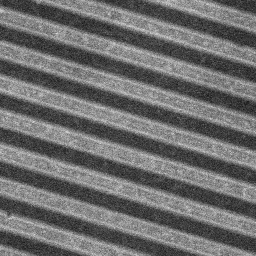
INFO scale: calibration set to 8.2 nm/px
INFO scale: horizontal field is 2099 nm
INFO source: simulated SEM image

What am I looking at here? parallel lines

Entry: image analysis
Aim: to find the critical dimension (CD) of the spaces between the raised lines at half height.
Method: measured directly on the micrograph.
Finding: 147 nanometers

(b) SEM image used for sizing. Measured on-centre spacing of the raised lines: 0.267 micrometres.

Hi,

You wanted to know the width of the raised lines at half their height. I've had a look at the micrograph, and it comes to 0.123 microns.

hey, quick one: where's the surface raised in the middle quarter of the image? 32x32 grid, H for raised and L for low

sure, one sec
HHHHLLLLLLLLLLLLLLLLHHHHHHHHHHHH
HHHHHHHHLLLLLLLLLLLLLLLHHHHHHHHH
HHHHHHHHHHHLLLLLLLLLLLLLLLLHHHHH
LHHHHHHHHHHHHHLLLLLLLLLLLLLLLLHH
LLLLLHHHHHHHHHHHHHLLLLLLLLLLLLLL
LLLLLLLLHHHHHHHHHHHHHLLLLLLLLLLL
LLLLLLLLLLLHHHHHHHHHHHHHLLLLLLLL
LLLLLLLLLLLLLLLHHHHHHHHHHHHLLLLL
HHLLLLLLLLLLLLLLLLHHHHHHHHHHHHHL
HHHHHHLLLLLLLLLLLLLLLHHHHHHHHHHH
HHHHHHHHHLLLLLLLLLLLLLLLLHHHHHHH
HHHHHHHHHHHHLLLLLLLLLLLLLLLLHHHH
LLLHHHHHHHHHHHHHLLLLLLLLLLLLLLLH
LLLLLLHHHHHHHHHHHHHLLLLLLLLLLLLL
LLLLLLLLLHHHHHHHHHHHHHLLLLLLLLLL
LLLLLLLLLLLLLHHHHHHHHHHHHLLLLLLL
HLLLLLLLLLLLLLLLHHHHHHHHHHHHHLLL
HHHHLLLLLLLLLLLLLLLHHHHHHHHHHHHH
HHHHHHHHLLLLLLLLLLLLLLHHHHHHHHHH
HHHHHHHHHHHLLLLLLLLLLLLLLLHHHHHH
LHHHHHHHHHHHHHLLLLLLLLLLLLLLLHHH
LLLLLHHHHHHHHHHHHHLLLLLLLLLLLLLL
LLLLLLLLHHHHHHHHHHHHHLLLLLLLLLLL
LLLLLLLLLLLHHHHHHHHHHHHHLLLLLLLL
LLLLLLLLLLLLLLLHHHHHHHHHHHHHLLLL
HHLLLLLLLLLLLLLLLLHHHHHHHHHHHHHL
HHHHHHLLLLLLLLLLLLLLLHHHHHHHHHHH
HHHHHHHHHLLLLLLLLLLLLLLLLHHHHHHH
HHHHHHHHHHHHLLLLLLLLLLLLLLLLHHHH
LLLHHHHHHHHHHHHHLLLLLLLLLLLLLLLH
LLLLLLHHHHHHHHHHHHHLLLLLLLLLLLLL
LLLLLLLLLHHHHHHHHHHHHHLLLLLLLLLL